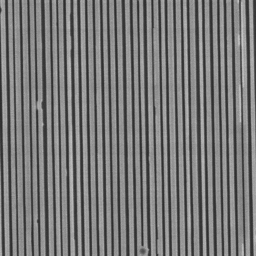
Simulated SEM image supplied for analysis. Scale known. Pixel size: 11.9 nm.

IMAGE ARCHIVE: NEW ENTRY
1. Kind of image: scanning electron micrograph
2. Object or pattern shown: parallel lines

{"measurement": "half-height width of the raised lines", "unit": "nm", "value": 47.5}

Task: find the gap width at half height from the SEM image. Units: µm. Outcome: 0.0342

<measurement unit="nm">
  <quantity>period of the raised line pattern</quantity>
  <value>86.6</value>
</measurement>